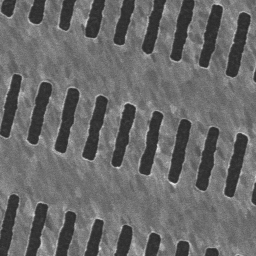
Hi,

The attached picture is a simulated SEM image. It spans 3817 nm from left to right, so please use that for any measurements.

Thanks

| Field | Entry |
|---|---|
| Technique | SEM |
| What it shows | a regular array of holes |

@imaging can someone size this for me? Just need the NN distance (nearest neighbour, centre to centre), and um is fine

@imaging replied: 0.432